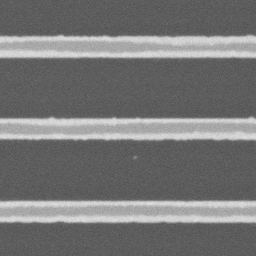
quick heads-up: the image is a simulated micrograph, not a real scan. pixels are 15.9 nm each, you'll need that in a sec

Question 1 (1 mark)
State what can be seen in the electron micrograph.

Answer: lines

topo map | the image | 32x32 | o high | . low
................................
................................
................................
................................
................................
oooooooooooooooooooooooooooooooo
oooooooooooooooooooooooooooooooo
................................
................................
................................
................................
................................
................................
................................
................................
oooooooooooooooooooooooooooooooo
oooooooooooooooooooooooooooooooo
................................
................................
................................
................................
................................
................................
................................
................................
oooooooooooooooooooooooooooooooo
oooooooooooooooooooooooooooooooo
ooooooo.oooooooooooooooooooooooo
................................
................................
................................
................................